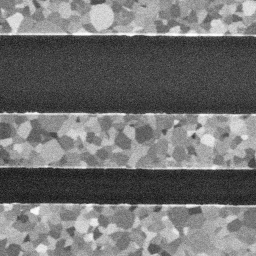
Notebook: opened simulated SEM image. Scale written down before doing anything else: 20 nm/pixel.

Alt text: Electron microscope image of lines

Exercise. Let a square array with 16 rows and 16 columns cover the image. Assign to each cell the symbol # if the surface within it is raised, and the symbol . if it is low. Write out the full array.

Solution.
################
################
................
................
................
................
................
################
################
################
.......#########
................
................
################
################
################